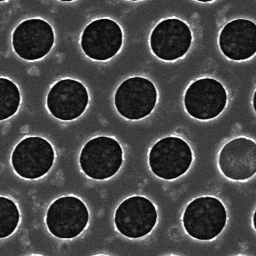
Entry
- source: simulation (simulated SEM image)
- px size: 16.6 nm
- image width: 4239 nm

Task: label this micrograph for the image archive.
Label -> a regular array of holes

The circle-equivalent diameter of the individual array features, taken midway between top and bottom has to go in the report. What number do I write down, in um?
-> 0.695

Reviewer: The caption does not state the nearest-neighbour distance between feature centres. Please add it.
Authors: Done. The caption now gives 1.13 microns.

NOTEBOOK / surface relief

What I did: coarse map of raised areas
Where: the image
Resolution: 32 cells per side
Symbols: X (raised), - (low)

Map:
XXXXXXXXXXXXXXXXXXXXXXXXXXXXXXXX
XXXXXXXXXXXXXXXXXXXXXXXXXXXXXXXX
XXX--XXXXXXX--XXXXXXX-XXXXXXX--X
XX----XXXXX----XXXX-----XXXX----
XX-----XXX-----XXXX-----XXX-----
XX-----XXX-----XXXX-----XXX-----
XX----XXXXX----XXXX----XXXXX----
XXXXXXXXXXXX-XXXXXXXX-XXXXXXX-XX
XXXXXXXXXXXXXXXXXXXXXXXXXXXXXXXX
XXXXXXXXXXXXXXXXXXXXXXXXXXXXXXXX
--XXXXX---XXXXX----XXXXX----XXXX
--XXXX-----XXXX-----XXX-----XXXX
---XXX-----XXX------XXX-----XXXX
--XXXX-----XXXX----XXXX-----XXXX
-XXXXXX---XXXXX---XXXXXX---XXXXX
XXXXXXXXXXXXXXXXXXXXXXXXXXXXXXXX
XXXXXXXXXXXXXXXXXXXXXXXXXXXXXXXX
XXX---XXXXX---XXXXXX---XXXXXX--X
XX-----XXX-----XXXX-----XXXX----
XX-----XXX-----XXXX-----XXX-----
XX-----XXX-----XXXX-----XXX-----
XX----XXXXX----XXXX----XXXXX----
XXXXXXXXXXXXXXXXXXXXXXXXXXXXX-XX
XXXXXXXXXXXXXXXXXXXXXXXXXXXXXXXX
XXXXXXXXXXXXXXXXXXXXXXXXXXXXXXXX
--XXXX----XXXXX----XXXXX----XXXX
--XXXX-----XXX-----XXXX-----XXXX
--XXXX-----XXX------XXX-----XXXX
--XXXX-----XXXX----XXXX-----XXXX
-XXXXXX---XXXXXX--XXXXXX---XXXXX
XXXXXXXXXXXXXXXXXXXXXXXXXXXXXXXX
XXXXXXXXXXXXXXXXXXXXXXXXXXXXXXXX